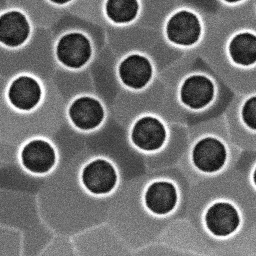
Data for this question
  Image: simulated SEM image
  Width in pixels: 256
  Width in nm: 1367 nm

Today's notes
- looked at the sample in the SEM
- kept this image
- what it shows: a regular array of holes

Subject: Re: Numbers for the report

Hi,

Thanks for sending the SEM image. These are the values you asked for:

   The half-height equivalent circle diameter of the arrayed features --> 0.189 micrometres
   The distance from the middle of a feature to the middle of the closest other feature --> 64.1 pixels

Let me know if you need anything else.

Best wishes